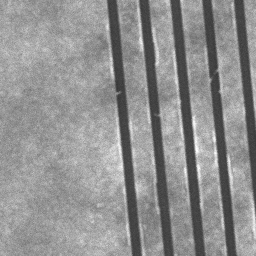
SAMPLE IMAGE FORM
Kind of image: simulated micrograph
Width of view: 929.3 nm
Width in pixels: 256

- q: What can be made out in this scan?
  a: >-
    parallel lines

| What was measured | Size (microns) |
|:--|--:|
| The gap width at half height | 0.0343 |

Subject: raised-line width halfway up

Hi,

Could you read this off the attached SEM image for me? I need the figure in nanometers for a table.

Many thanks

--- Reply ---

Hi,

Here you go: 81.4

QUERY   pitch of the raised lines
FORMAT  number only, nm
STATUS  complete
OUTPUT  114